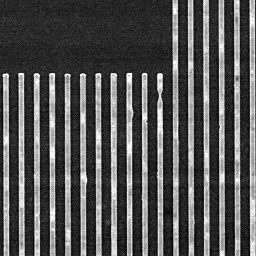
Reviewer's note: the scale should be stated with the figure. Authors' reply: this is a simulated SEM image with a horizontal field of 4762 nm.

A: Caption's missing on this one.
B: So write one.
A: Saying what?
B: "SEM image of parallel lines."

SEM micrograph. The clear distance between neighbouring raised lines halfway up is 0.191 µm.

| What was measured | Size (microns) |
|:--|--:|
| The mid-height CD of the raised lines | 0.0953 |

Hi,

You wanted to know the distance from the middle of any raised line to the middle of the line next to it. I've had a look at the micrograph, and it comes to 286 nanometers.